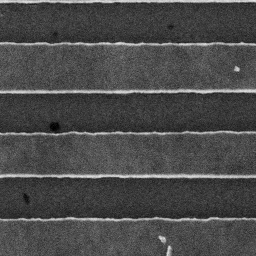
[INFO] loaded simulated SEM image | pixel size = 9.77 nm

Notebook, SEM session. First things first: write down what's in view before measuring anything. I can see lines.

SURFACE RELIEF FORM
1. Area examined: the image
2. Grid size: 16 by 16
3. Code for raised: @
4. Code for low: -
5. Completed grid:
----------------
----------------
----------------
@@@@@@@@@@@@@@@@
@@@@@@@@@@@@@@@@
@@@@@@@@@@@@@@@@
----------------
----------------
@@@@@@@@@@@@@@@@
@@@@@@@@@@@@@@@@
@@@@@@@@@@@@@@@@
----------------
----------------
----------------
@@@@@@@@@@@@@@@@
@@@@@@@@@@@@@@@@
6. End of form